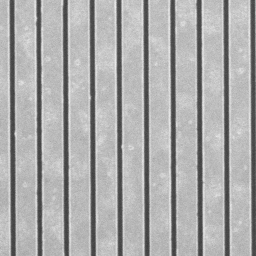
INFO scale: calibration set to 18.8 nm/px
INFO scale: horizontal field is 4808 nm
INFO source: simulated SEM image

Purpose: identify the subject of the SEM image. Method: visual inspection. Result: parallel lines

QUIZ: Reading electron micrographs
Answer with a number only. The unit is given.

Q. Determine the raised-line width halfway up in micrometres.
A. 0.387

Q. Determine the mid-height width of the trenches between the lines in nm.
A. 117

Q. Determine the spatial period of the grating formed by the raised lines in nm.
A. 503